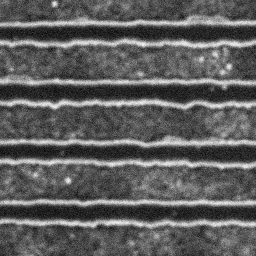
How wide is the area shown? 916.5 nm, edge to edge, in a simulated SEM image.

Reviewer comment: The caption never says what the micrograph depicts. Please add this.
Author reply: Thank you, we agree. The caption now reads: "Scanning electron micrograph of lines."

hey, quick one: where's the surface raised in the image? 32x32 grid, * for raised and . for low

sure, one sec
................................
................................
........................*.......
********************************
********************************
***.*******..**..***************
................................
................................
................................
................................
********************************
********************************
********************************
................................
................................
................................
................................
................................
********************************
********************************
............***..**.************
................................
................................
................................
................................
********************************
********************************
********************************
................................
................................
................................
................................